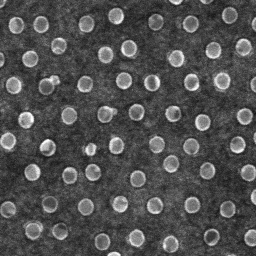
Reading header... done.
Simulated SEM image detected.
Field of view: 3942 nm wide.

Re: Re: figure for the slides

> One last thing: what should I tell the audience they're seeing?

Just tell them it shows a regular array of raised bodies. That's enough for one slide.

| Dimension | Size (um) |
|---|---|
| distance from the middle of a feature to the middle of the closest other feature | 0.47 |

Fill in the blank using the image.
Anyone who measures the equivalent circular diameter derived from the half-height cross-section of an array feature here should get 235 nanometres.